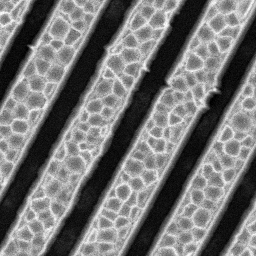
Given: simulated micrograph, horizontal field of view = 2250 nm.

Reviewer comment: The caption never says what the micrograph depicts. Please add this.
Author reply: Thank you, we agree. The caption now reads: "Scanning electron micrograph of one or a few lines or trenches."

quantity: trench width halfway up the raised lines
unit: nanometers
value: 203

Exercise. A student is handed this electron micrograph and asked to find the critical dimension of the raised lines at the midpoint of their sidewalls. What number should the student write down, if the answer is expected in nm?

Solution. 378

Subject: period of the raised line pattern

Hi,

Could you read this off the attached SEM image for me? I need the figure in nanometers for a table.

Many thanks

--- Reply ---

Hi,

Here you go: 589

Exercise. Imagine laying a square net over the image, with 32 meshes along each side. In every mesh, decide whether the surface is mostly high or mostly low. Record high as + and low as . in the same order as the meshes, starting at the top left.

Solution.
++++...++++++....++++++...++++++
+++...+++++++...++++++....++++++
+++...++++++....+++++....++++++.
++...+++++++...++++++....++++++.
++...++++++....++++++...++++++..
+...+++++++...++++++...+++++++..
+...++++++...++++++....++++++...
...++++++....++++++...++++++....
...++++++...++++++....++++++...+
..++++++....++++++...+++++++...+
..++++++...++++++....++++++...++
.++++++....++++++...+++++++...++
.++++++...++++++...+++++++...+++
++++++....++++++...+++++++...+++
++++++...++++++....++++++...++++
+++++....+++++....++++++....++++
++++....++++++...+++++++...+++++
++++...+++++++...++++++...++++++
+++....++++++...+++++++...++++++
+++...+++++++...++++++...++++++.
++....++++++...+++++++...++++++.
++...++++++....++++++...++++++..
+....++++++...++++++....++++++..
+...++++++....++++++...++++++...
....++++++...++++++....++++++...
...++++++...+++++++...++++++....
...++++++...++++++....++++++...+
..++++++...+++++++...++++++...++
..+++++....++++++...+++++++...++
.++++++...+++++++...++++++...+++
.+++++....++++++...++++++....+++
++++++...+++++++...++++++...++++